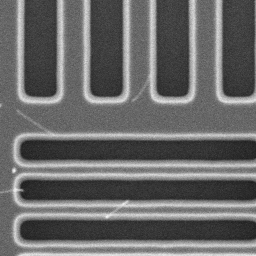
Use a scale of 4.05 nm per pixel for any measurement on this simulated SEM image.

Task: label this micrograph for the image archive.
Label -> groups of lines, slits or small figures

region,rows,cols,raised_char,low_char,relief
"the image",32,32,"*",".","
***....****.....***.....***.....
***....****.....***.....***.....
***....****.....***.....***.....
***....****.....***.....***.....
***....****.....***.....***.....
***....****.....***.....***.....
***....****.....***.....***.....
***....****.....***.....***.....
***....****.....***.....***.....
***....****.....***.....***.....
***....****.....***.....***.....
***....****.....***.....****....
********************************
********************************
********************************
********************************
********************************
***.............................
**..............................
**..............................
********************************
********************************
***.............................
**..............................
**..............................
********************************
********************************
***.............................
**..............................
**..............................
********************************
********************************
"